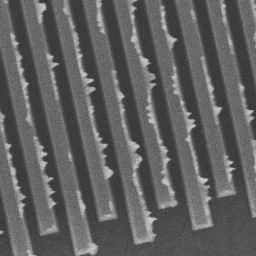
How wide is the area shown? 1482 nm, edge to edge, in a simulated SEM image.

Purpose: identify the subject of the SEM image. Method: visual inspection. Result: parallel lines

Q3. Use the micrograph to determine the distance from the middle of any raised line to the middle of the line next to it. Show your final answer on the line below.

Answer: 174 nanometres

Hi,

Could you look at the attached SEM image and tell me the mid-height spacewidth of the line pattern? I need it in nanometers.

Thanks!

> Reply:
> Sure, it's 75.7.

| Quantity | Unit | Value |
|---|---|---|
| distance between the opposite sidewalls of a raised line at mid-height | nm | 101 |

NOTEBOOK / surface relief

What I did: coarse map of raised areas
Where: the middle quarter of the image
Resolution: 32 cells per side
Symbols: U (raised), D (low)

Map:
DUUUUDDDUUUUUDDDUUUUUDDDUUUUDDDU
DUUUUDDDDUUUUDDDUUUUUDDDUUUUDDDD
DUUUUUDDDUUUUDDDUUUUUUDDUUUUDDDD
DUUUUUDDDUUUUDDDDUUUUUUDUUUUUDDD
DUUUUUUDDUUUUDDDDUUUUUDDDUUUUDDD
DDUUUUDDDUUUUUDDDUUUUUUDDUUUUDDD
DDUUUUUUDDUUUUDDDUUUUUDDDUUUUDDD
DDUUUUDDDDUUUUUDDUUUUUDDDUUUUDDD
DDUUUUDDDDUUUUUDDDUUUUDDDUUUUUDD
DDDUUUUDDDUUUUDDDDUUUUDDDDUUUUDD
DDDUUUUDDDDUUUUDDDUUUUUDDDUUUUDD
DDDUUUUDDDDUUUUDDDUUUUUDDDUUUUUD
DDDUUUUDDDDUUUUDDDDUUUUDDDUUUUUU
DDDUUUUUDDDUUUUDDDDUUUUDDDDUUUUD
DDDDUUUUDDDUUUUUDDDUUUUDDDDUUUUU
DDDDUUUUDDDDUUUUDDDUUUUUDDDUUUUU
DDDDUUUUDDDDUUUUDDDUUUUUDDDUUUUU
UDDDUUUUUDDDUUUUDDDDUUUUDDDUUUUU
UDDDDUUUUDDDUUUUDDDDUUUUDDDDUUUU
UDDDDUUUUDDDDUUUUUDDUUUUUDDDUUUU
UDDDDUUUUUUDDUUUUUUDUUUUUDDDUUUU
UUDDDUUUUUDDDUUUUUDDDUUUUUDDUUUU
UUDDDUUUUUDDDUUUUUDDDUUUUUDDDUUU
UUDDDDUUUUDDDUUUUUUDDUUUUUDDDUUU
UUDDDDUUUUDDDDUUUUUDDUUUUUDDDUUU
UUDDDDUUUUUDDDUUUUUDDUUUUUDDDUUU
UUUDDDUUUUUUDDUUUUDDDDUUUUDDDUUU
UUUDDDDUUUUUDDUUUUDDDDUUUUDDDDUU
UUUDDDDUUUUDDDDUUUUDDDUUUUDDDDUU
UUUDDDDUUUUDDDDUUUUDDDUUUUDDDDUU
UUUUDDDUUUUDDDDUUUUDDDDUUUUDDDUU
UUUUDDDUUUUUDDDUUUUDDDDUUUUDDDDU